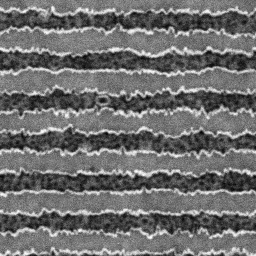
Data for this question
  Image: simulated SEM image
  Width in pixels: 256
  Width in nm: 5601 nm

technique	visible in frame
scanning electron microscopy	parallel lines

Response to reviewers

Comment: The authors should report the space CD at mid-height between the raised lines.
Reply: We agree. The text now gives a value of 0.451 µm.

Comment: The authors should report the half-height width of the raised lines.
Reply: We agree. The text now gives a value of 429 nm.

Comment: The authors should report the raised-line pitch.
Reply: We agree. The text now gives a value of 879 nanometers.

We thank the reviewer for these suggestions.